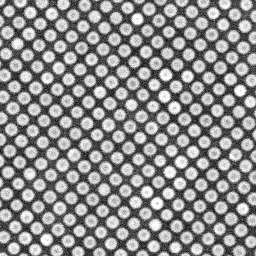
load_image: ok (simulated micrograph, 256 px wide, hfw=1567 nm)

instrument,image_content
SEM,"a regular array of raised bodies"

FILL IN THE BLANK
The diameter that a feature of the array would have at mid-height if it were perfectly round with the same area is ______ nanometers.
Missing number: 69.4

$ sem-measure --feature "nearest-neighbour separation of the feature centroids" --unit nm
91.9